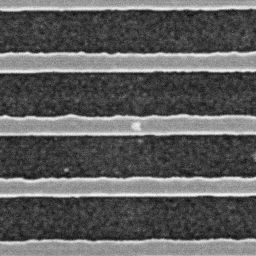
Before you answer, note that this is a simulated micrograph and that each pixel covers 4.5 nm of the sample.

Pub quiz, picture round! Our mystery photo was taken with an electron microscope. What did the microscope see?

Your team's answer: lines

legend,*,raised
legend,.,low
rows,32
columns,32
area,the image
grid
********************************
................................
................................
................................
................................
................................
................................
********************************
********************************
................................
................................
................................
................................
................................
*.......**....*....*.****..****.
********************************
********************************
................................
................................
................................
................................
................................
***..***************************
********************************
**.....**.......................
................................
................................
................................
................................
................................
********************************
********************************